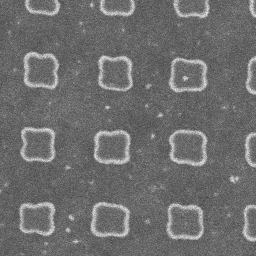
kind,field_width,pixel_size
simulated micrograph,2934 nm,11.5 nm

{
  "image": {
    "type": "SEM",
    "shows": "a regular array of raised bodies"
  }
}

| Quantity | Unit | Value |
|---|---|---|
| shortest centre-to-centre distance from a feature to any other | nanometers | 834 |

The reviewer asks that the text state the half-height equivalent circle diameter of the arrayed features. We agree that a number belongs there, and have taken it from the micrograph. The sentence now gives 399 nanometers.